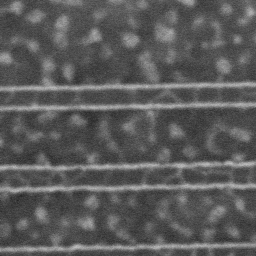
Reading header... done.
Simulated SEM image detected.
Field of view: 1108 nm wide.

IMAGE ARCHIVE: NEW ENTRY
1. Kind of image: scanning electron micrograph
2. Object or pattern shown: one or a few lines or trenches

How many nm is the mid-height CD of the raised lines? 91.5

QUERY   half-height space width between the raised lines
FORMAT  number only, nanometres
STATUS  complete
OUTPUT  256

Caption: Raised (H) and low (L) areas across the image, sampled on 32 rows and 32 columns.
LLLLLLLLLLLLLLLLLLLLLLLLLLLLLLLL
LLLLLLLLLLLLLLLLLLLLLLLLLLLLLLLL
LLLLLLLLLLLLLLLLLLLLLLLLLLLLLLLL
LLLLLLLLLLLLLLLLLLLLLLLLLLLLLLLL
LLLLLLLLLLLLLLLLLLLLLLLLLLLLLLLL
LLLLLLLLLLLLLLLLLLLLLLLLLLLLLLLL
LLLLLLLLLLLLLLLLLLLLLLLLLLLLLLLL
LLLLLLLLLLLLLLLLLLLLLLLLLLLLLLLL
LLLLLLLLLLLLLLLLLLLLLLLLLLLLLLLL
LLLLLLLLLLLLLLLLLLLLLLLLLLLLLLLL
LLLLLLLLLLLLLLLLLLLLLLLLLLLLLLLL
HHHHHHHHHHHHHHHHHHHHHHHHHHHHHHHH
HHHHHHHHHHHHHHHHHHHHHHHHHHHHHHHH
HHHHLLLLHLLLLLLLLLLLLLLLLLLLLLLL
LLLLLLLLLLLLLLLLLLLLLLLLLLLLLLLL
LLLLLLLLLLLLLLLLLLLLLLLLLLLLLLLL
LLLLLLLLLLLLLLLLLLLLLLLLLLLLLLLL
LLLLLLLLLLLLLLLLLLLLLLLLLLLLLLLL
LLLLLLLLLLLLLLLLLLLLLLLLLLLLLLLL
LLLLLLLLLLLLLLLLLLLLLLLLLLLLLLLL
LLLLLLLLLLLLLLLLLLLLLLLLLHLLHLLH
HHHHHHHHHHHHHHHHHHHHHHHHHHHHHHHH
HHHHHHHHHHHHHHHHHHHHHHHHHHHHHHHH
HHHHHHHHHHLLLHHHLLLLLLLLLLLLLLLL
LLLLLLLLLLLLLLLLLLLLLLLLLLLLLLLL
LLLLLLLLLLLLLLLLLLLLLLLLLLLLLLLL
LLLLLLLLLLLLLLLLLLLLLLLLLLLLLLLL
LLLLLLLLLLLLLLLLLLLLLLLLLLLLLLLL
LLLLLLLLLLLLLLLLLLLLLLLLLLLLLLLL
LLLLLLLLLLLLLLLLLLLLLLLLLLLLLLLL
LLLLLLLLLLLLLLLLLLLLLLLLLLLLLLLL
HHHHHHHHHHHHHHHHHHHHHHHHHHHHHHHH